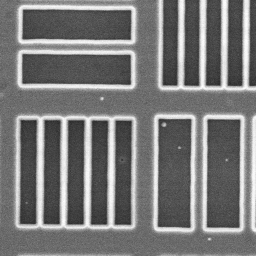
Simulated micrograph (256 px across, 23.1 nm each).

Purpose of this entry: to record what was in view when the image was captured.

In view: groups of lines, slits or small figures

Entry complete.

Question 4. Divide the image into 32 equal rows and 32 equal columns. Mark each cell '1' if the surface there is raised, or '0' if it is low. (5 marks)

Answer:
11111111111111111111000000000000
11100000000000000111000000000000
11100000000000000111000000000000
11100000000000000111000000000000
11100000000000000111001000000000
11111111111111111111000000000000
11100000000111111111000000000000
11100000000000000111000001000000
11100000000000000111000001000000
11100000000000000111000001000000
11100000000000001111001001000000
11111111111111111111111111111111
11111111111111111111111111111111
11111111111111111111111111111111
11111111111111111111111111111111
11000000000000000111000011000011
11000000000000000111000011000011
11000000000000000110000011000011
11000000000000000111000011000011
11000000000000000111000011000011
11000000000000000110000011000011
11000000000000000110000011000011
11000000000000000110000011000011
11000000000000000110000011000011
11000000000000000110000011000011
11000000000000000110000011000011
11000000000000000110000011000011
11000000000000000110000011000011
11111111111111111111000011000011
11111111111111111111111111111111
11111111111111111111111111111111
11111111111111111111111111111111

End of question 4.